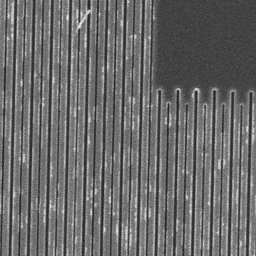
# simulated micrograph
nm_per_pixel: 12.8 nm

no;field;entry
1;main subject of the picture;parallel lines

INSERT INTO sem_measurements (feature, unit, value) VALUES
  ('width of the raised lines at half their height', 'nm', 86.7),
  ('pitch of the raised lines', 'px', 9.14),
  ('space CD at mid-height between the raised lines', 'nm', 36.9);